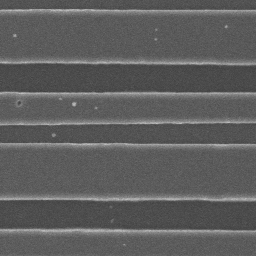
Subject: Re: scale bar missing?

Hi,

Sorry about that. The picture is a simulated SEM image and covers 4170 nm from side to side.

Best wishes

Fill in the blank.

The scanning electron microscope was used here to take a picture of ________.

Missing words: lines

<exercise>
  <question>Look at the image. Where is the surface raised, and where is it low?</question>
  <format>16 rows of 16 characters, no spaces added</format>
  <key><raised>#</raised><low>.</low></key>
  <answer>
################
################
################
################
................
................
################
################
################
################
################
################
................
................
################
################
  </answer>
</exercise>